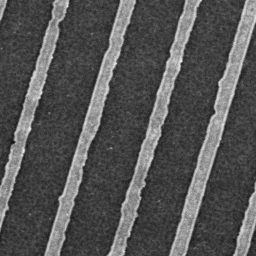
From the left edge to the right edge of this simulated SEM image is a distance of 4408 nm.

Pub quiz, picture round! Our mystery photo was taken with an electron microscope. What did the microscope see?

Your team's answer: one or a few lines or trenches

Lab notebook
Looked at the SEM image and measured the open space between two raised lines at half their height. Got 866 nanometres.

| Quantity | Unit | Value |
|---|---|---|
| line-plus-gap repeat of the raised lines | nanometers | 1050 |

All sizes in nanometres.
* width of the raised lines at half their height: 204